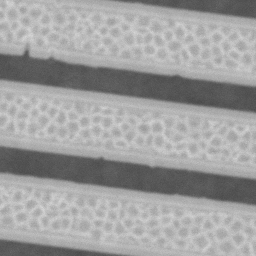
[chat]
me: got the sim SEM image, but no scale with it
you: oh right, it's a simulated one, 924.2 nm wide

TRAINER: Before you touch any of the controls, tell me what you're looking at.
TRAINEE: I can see one or a few lines or trenches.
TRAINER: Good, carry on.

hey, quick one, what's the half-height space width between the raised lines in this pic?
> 137 nanometers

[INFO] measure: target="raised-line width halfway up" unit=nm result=197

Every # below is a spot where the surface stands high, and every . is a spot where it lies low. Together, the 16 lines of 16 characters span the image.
########........
###############.
################
....############
............####
#...............
#########.......
################
################
......##########
.............###
###.............
###########.....
################
################
.......#########